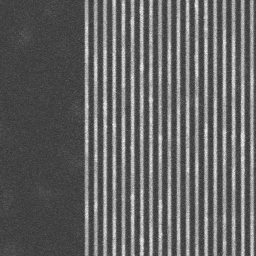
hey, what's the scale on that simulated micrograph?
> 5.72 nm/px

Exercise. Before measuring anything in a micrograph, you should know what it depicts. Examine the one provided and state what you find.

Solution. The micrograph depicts parallel lines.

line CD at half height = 13.6 nm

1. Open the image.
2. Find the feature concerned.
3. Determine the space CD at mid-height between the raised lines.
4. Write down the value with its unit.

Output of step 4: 0.0358 micrometres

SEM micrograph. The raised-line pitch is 52.5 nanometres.